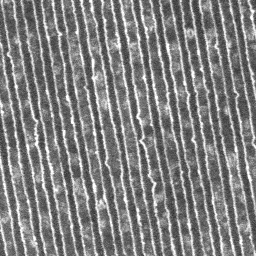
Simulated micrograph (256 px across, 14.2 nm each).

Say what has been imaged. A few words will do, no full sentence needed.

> parallel lines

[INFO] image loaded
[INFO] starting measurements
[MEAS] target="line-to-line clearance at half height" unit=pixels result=7.51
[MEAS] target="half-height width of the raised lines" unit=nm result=160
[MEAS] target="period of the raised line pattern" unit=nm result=276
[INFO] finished